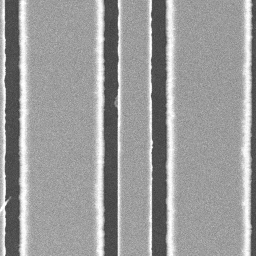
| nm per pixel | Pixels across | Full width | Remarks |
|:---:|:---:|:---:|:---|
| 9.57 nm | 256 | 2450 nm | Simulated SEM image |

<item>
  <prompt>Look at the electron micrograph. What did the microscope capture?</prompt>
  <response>lines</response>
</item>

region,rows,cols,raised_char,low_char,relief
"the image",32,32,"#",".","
#..##########..####..##########.
#..##########..####..##########.
#..##########..####..##########.
#..##########..####..##########.
#..##########..####..##########.
#..##########..####..##########.
#..##########..####..##########.
#..##########..####..##########.
#..##########..####..##########.
#..##########..####..##########.
#..##########..####..##########.
#..##########..####..##########.
#..##########..####..##########.
#..##########..####..##########.
#..##########..####..##########.
#..##########..####..##########.
#..##########..####..##########.
#..##########..####..##########.
#..##########..####..##########.
#..##########..####..##########.
#..##########..####..##########.
#..##########..####..##########.
#..##########..####..##########.
#..##########..####..##########.
#..##########..####..##########.
#..##########..####..##########.
#..##########..####..##########.
#..##########..####..##########.
#..##########..####..##########.
#..##########..####..##########.
#..##########..####..##########.
#..##########..####..##########.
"